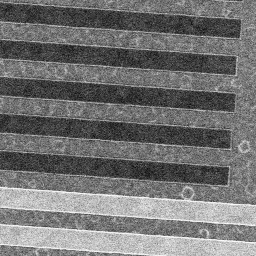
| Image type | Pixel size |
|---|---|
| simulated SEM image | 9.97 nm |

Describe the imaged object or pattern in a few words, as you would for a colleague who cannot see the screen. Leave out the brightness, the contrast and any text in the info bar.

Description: parallel lines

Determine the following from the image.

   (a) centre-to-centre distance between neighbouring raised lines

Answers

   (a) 364 nm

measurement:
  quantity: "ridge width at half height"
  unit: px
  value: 20.1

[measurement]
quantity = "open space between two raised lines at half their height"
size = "168 nanometers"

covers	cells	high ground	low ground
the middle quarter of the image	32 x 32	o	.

.........ooooooooooooooooooooooo
.......................ooooooooo
.........................o......
................................
oooo............................
ooooooooooooooooo...............
oooooooooooooooooooooooooooooo..
oooooooooooooooooooooooooooooooo
oooooooooooooooooooooooooooooooo
......oooooooooooooooooooooooooo
..................oooooooooooooo
................................
................................
................................
oooooooooooooo..................
oooooooooooooooooooooooooooo....
oooooooooooooooooooooooooooooooo
oooooooooooooooooooooooooooooooo
..oooooooooooooooooooooooooooooo
................oooooooooooooooo
..............................oo
................................
................................
ooooooooooo.....................
ooooooooooooooooooooooooo.......
oooooooooooooooooooooooooooooooo
oooooooooooooooooooooooooooooooo
oooooooooooooooooooooooooooooooo
...........ooooooooooooooooooooo
.........................ooooooo
................................
................................